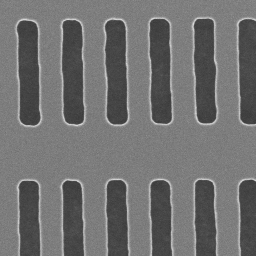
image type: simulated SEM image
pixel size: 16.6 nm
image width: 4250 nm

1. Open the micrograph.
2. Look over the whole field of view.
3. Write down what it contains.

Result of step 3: holes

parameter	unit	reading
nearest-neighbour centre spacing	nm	728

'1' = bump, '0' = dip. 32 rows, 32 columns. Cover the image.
11111111111111111111111111111111
11111111111111111111111111111111
11111111011111011110011110111100
11000111001110001110011100011100
11000111001110001110011100011100
11000111001110001110011100011100
11000111001110001110011100011100
11000111001110001110011100011100
11000111001110001110011100011100
11000111001110001110011100011100
11000111001110001110011100011100
11000111001110001110011100011100
11000111001110001110001100011100
11000111001110001110001110011100
11000111001110001110001110011100
11100111101111011111011111111110
11111111111111111111111111111111
11111111111111111111111111111111
11111111111111111111111111111111
11111111111111111111111111111111
11111111111111111111111111111111
11111111111111111111111111111111
11101111111111011111111110111111
11000111001110001110011100011100
11000111001110001110011100011100
11000111001110001110011100011100
11000111001110001110011100011100
11000111001110001110011100011100
11000111001110001110011100011100
11000111001110001110011100011100
11000111000110001110011100011100
11000111000110001110011100011100